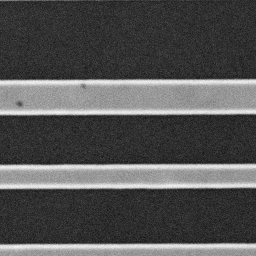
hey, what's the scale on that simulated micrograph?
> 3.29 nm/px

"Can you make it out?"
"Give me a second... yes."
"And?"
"groups of lines, slits or small figures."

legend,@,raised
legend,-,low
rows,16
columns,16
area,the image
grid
----------------
----------------
----------------
----------------
----------------
@@@@@@@@@@@@@@@@
@@@@@@@@@@@@@@@@
----------------
----------------
----------------
@@@@@@@@@@@@@@@@
@@@@@@@@@@@@@@@@
----------------
----------------
----------------
@@@@@@@@@@@@@@@@